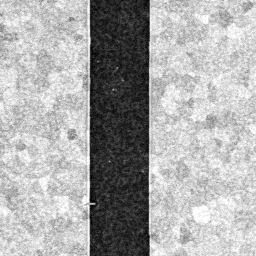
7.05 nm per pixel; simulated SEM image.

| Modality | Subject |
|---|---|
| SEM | one or a few lines or trenches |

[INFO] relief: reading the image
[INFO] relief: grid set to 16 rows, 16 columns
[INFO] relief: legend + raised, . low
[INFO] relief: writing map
++++++...+++++++
++++++...+++++++
++++++...+++++++
++++++...+++++++
++++++...+++++++
++++++...+++++++
++++++...+++++++
++++++...+++++++
++++++...+++++++
++++++...+++++++
++++++...+++++++
++++++...+++++++
++++++...+++++++
+++++....+++++++
+++++....+++++++
+++++....+++++++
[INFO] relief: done